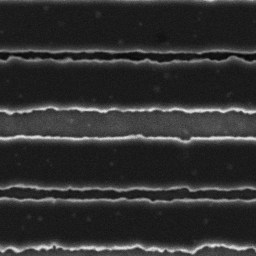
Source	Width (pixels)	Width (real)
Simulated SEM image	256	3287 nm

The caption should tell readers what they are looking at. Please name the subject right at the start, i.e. one or a few lines or trenches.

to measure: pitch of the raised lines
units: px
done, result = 69.5